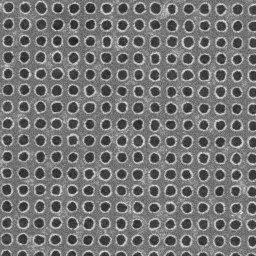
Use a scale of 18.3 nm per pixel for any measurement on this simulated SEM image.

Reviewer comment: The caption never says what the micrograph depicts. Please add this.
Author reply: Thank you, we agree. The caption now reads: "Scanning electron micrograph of a regular array of holes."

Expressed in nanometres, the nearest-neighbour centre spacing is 292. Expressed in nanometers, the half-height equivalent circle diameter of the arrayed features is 190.